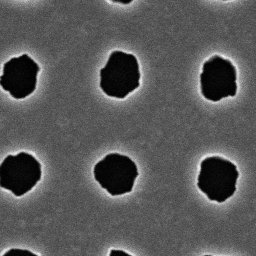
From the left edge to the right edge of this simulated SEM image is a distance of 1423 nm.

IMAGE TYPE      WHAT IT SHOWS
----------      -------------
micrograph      holes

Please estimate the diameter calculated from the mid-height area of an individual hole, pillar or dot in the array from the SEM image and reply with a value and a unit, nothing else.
0.235 microns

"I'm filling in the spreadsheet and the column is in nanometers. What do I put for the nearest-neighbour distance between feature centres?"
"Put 547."